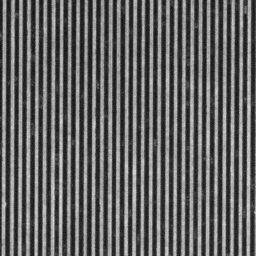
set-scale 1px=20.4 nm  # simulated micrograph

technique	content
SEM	parallel lines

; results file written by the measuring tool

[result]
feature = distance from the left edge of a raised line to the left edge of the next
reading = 166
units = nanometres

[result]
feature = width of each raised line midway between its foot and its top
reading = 53.5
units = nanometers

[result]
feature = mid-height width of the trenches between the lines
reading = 122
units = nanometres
